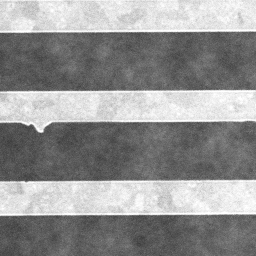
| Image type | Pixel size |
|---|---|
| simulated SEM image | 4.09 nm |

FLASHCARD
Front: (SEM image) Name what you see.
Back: one or a few lines or trenches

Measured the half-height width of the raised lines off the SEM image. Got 0.133 micrometres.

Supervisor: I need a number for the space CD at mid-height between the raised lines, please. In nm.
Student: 247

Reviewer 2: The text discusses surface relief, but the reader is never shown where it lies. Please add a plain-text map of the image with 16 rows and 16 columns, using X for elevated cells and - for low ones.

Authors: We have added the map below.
XXXXXXXXXXXXXXXX
XXXXXXXXXXXXXXXX
----------------
----------------
----------------
----------------
XXXXXXXXXXXXXXXX
XXXXXXXXXXXXXXX-
----------------
----------------
----------------
XXXXXXXXXXXXXXXX
XXXXXXXXXXXXXXXX
----------------
----------------
----------------